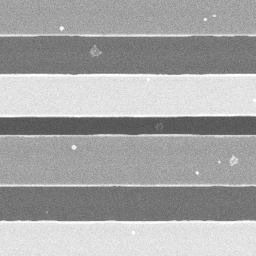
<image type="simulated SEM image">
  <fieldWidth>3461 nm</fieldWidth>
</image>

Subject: lines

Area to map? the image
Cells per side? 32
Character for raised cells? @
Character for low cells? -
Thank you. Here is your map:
@@@@@@@@@@@@@@@@@@@@@@@@@@@@@@@@
@@@@@@@@@@@@@@@@@@@@@@@@@@@@@@@@
@@@@@@@@@@@@@@@@@@@@@@@@@@@@@@@@
@@@@@@@@@@@@@@@@@@@@@@@@@@@@@@@@
--------------------------------
--------------------------------
--------------------------------
--------------------------------
--------------------------------
@@@@@@@@@@@@@@@@@@@@@@@@@@@@@@@@
@@@@@@@@@@@@@@@@@@@@@@@@@@@@@@@@
@@@@@@@@@@@@@@@@@@@@@@@@@@@@@@@@
@@@@@@@@@@@@@@@@@@@@@@@@@@@@@@@@
@@@@@@@@@@@@@@@@@@@@@@@@@@@@@@@@
@@@@@@@@@@@@@@@@@@@@@@@---------
--------------------------------
--------------------------------
@@@@@@@@@@@@@@@@@@@@@@@@@@@@@@@@
@@@@@@@@@@@@@@@@@@@@@@@@@@@@@@@@
@@@@@@@@@@@@@@@@@@@@@@@@@@@@@@@@
@@@@@@@@@@@@@@@@@@@@@@@@@@@@@@@@
@@@@@@@@@@@@@@@@@@@@@@@@@@@@@@@@
@@@@@@@@@@@@@@@@@@@@@@@@@@@@@@@@
--------------------------------
--------------------------------
--------------------------------
--------------------------------
--------------------------------
@@@@@@@@@@@@@@@@@@@@@@@@@@@@@@@@
@@@@@@@@@@@@@@@@@@@@@@@@@@@@@@@@
@@@@@@@@@@@@@@@@@@@@@@@@@@@@@@@@
@@@@@@@@@@@@@@@@@@@@@@@@@@@@@@@@